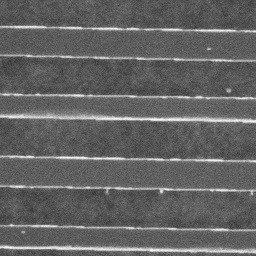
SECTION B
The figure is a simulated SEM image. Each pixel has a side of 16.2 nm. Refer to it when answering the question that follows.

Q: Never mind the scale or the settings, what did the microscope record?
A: lines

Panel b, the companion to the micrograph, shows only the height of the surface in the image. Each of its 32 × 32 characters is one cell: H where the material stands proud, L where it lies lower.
LLLLLLLLLLLLLLLLLLLLLLLLLLLLLLLL
LLLLLLLLLLLLLLLLLLLLLLLLLLLLLLLL
LLLLLLLLLLLLLLLLLLLLLLLLLLLLLLLL
HHHHHHHHHHLLLLLLLLLLLLLLLLLLLLLL
HHHHHHHHHHHHHHHHHHHHHHHHHHHHHHHH
HHHHHHHHHHHHHHHHHHHHHHHHHHHHHHHH
HHHHHHHHHHHHHHHHHHHHHHHHHHHHHHHH
LLLLLLLLLLLLLLLLLLLLLLLLLLLHHHHH
LLLLLLLLLLLLLLLLLLLLLLLLLLLLLLLL
LLLLLLLLLLLLLLLLLLLLLLLLLLLLLLLL
LLLLLLLLLLLLLLLLLLLLLLLLLLLLLLLL
LLLLLLLLLLLLLLLLLLLLLLLLLLLLLLLL
HHHHHHHHHHHHHHHHHHHHHHHHHHHHHHHH
HHHHHHHHHHHHHHHHHHHHHHHHHHHHHHHH
HHHHHHHHHHHHHHHHHHHHHHHHHHHHHHHH
LLLLLLLLLLLLLLLLLLLLLLLLLLLLLLLL
LLLLLLLLLLLLLLLLLLLLLLLLLLLLLLLL
LLLLLLLLLLLLLLLLLLLLLLLLLLLLLLLL
LLLLLLLLLLLLLLLLLLLLLLLLLLLLLLLL
LLLLLLLLLLLLLLLLLLLLLLLLLLLLLLLL
HHHHHHHHHHHHHHHHHHHHHHHHHHHHHHHH
HHHHHHHHHHHHHHHHHHHHHHHHHHHHHHHH
HHHHHHHHHHHHHHHHHHHHHHHHHHHHHHHH
LLLLLLLLLLLLLHHHHHHHHHHHHHHHHHHH
LLLLLLLLLLLLLLLLLLLLLLLLLLLLLLLL
LLLLLLLLLLLLLLLLLLLLLLLLLLLLLLLL
LLLLLLLLLLLLLLLLLLLLLLLLLLLLLLLL
LLLLLLLLLLLLLLLLLLLLLLLLLLLLLLLL
HHHHHHHHHHHHHHHHHLLLLLLLLLLLLLLL
HHHHHHHHHHHHHHHHHHHHHHHHHHHHHHHH
HHHHHHHHHHHHHHHHHHHHHHHHHHHHHHHH
LLLLLLLLLLLLLLLLLLLLLLLLLLLLLLLL